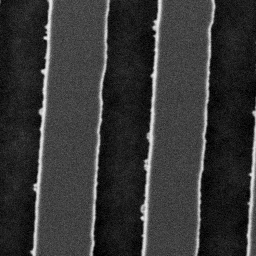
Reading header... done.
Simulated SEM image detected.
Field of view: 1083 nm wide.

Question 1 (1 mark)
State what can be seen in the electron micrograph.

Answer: lines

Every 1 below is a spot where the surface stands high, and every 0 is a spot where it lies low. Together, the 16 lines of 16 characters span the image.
0001111000111000
0001111000111000
0001111000111000
0001111000111000
0001111000111000
0001110000111000
0001110000111000
0001110001111000
0001110001111000
0011110001111000
0011110001111000
0011110001111000
0011110001111000
0011110001111000
0011110001110000
0011110001110001